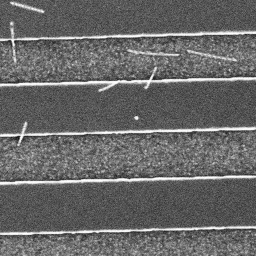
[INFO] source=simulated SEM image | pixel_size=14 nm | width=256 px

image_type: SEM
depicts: lines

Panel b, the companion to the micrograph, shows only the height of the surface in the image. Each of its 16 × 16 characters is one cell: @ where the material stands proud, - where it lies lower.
@@@@@@@@@@@@@@@@
@@@@@@@@@@@@@@@@
@---------------
----------------
----------------
@@@@@@@@@@@@@@@@
@@@@@@@@@@@@@@@@
@@@@@@@@@@@@@@@@
----------------
----------------
----------------
@@@@@@@@@@@@@@@@
@@@@@@@@@@@@@@@@
@@@@@@@@@@@@@@@@
@@@@@@----------
----------------